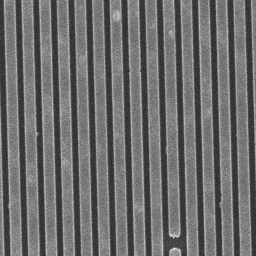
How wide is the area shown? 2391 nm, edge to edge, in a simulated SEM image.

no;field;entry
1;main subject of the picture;parallel lines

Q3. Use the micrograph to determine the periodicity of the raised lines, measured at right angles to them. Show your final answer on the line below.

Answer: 0.165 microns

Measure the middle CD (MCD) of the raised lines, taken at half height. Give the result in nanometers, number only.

98.1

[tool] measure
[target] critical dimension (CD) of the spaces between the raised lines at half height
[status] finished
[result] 65.4 nm